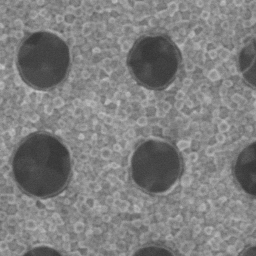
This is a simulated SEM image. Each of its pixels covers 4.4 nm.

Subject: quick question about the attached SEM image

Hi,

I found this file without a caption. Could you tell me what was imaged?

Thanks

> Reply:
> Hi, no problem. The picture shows raised bodies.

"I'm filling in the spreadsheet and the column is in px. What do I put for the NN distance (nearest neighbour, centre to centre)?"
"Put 70.8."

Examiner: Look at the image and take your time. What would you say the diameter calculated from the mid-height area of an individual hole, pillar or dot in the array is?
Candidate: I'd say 235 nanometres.